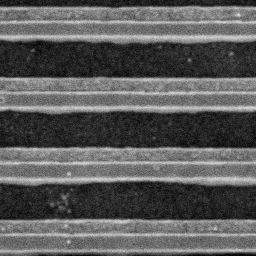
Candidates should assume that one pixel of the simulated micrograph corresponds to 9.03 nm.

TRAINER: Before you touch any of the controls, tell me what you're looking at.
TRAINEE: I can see lines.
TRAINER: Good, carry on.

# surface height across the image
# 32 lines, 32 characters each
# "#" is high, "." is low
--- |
................................
################################
################################
################################
################################
................................
................................
................................
................................
................................
################################
################################
################################
################################
................................
................................
................................
................................
................................
################################
################################
################################
###############.....############
................................
................................
................................
................................
................................
################################
################################
################################
#####........####..##...........